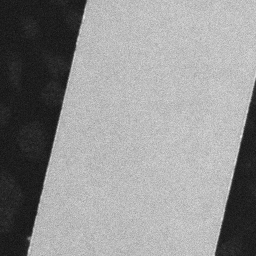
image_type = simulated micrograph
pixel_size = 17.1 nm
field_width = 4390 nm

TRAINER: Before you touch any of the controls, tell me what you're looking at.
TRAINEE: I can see one or a few lines or trenches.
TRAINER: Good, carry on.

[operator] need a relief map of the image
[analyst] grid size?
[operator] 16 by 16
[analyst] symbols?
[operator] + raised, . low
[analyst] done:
+++++...........
+++++...........
+++++...........
+++++...........
++++............
++++............
++++............
++++...........+
++++...........+
+++............+
+++............+
+++...........++
+++...........++
++............++
++............++
++...........+++